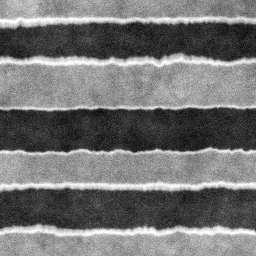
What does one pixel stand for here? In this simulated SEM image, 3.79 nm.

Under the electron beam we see lines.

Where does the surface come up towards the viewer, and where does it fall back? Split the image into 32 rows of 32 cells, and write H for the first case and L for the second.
HHHHHHHHHHHHHHHHHHHHHHHHHHHHHHHH
HHHHHHHHHHHHHHHHHHHHHHHHHHHHHHHH
HHHHHHHHHHHLHHHHHHHHHHHHHHLLHHHH
LLLLLLLLLLLLLLLLLLLLLLLLLLLLLLLL
LLLLLLLLLLLLLLLLLLLLLLLLLLLLLLLL
LLLLLLLLLLLLLLLLLLLLLLLLLLLLLLLL
LLLLLLLLLLLLLLLLLLLLLLLLLLLLLLLL
LLLLLLLLLLLLLLLLLLLLLLHLLLLLLLLL
HHHHHHHHHHHHHHHHHHHHHHHHHHHHHHHH
HHHHHHHHHHHHHHHHHHHHHHHHHHHHHHHH
HHHHHHHHHHHHHHHHHHHHHHHHHHHHHHHH
HHHHHHHHHHHHHHHHHHHHHHHHHHHHHHHH
HHHHHHHHHHHHHHHHHHHHHHHHHHHHHHHH
HHHHHHHHHHLHLLHLHLHHLHLLLLLLLLLL
LLLLLLLLLLLLLLLLLLLLLLLLLLLLLLLL
LLLLLLLLLLLLLLLLLLLLLLLLLLLLLLLL
LLLLLLLLLLLLLLLLLLLLLLLLLLLLLLLL
LLLLLLLLLLLLLLLLLLLLLLLLLLLLLLLL
LLLLLLLLLLLLLLLLLLLLLLLLLLLLLLLL
HHHHHHHHHHHHHHHHHHHHHHHHHHHHHHHH
HHHHHHHHHHHHHHHHHHHHHHHHHHHHHHHH
HHHHHHHHHHHHHHHHHHHHHHHHHHHHHHHH
HHHHHHHHHHHHHHHHHHHHHHHHHHHHHHHH
LLLLLLLLLLLLLLLLLLLLLLLLLLLLLLLL
LLLLLLLLLLLLLLLLLLLLLLLLLLLLLLLL
LLLLLLLLLLLLLLLLLLLLLLLLLLLLLLLL
LLLLLLLLLLLLLLLLLLLLLLLLLLLLLLLL
LLLLLLLLLLLLLLLLLLLLLLLLLLLLLLLL
LLLLLLLLLLLLLLLLLLLLLLLLLLLLLLLL
HHHHHHHHHHHHHHHHHHHHHHHHHHHHHHHH
HHHHHHHHHHHHHHHHHHHHHHHHHHHHHHHH
HHHHHHHHHHHHHHHHHHHHHHHHHHHHHHHH